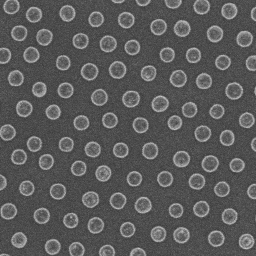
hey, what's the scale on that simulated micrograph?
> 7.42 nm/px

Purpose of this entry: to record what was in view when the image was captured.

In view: a regular array of raised bodies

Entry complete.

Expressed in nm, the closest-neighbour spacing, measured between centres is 192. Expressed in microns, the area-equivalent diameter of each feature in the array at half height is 0.11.